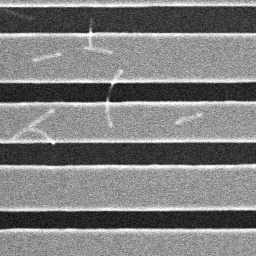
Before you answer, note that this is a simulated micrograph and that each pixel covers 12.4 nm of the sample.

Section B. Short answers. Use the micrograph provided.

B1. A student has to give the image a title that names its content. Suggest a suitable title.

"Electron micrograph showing lines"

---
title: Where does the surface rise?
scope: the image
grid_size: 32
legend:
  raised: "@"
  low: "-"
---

@@@@@@@@@@@@@@@@@@@@@@@@@@@@@@@@
--------------------------------
--------------------------------
--------------------------------
@@@@@@@@@@@@@@@@@@@@@@@@@@@@@@@@
@@@@@@@@@@@@@@@@@@@@@@@@@@@@@@@@
@@@@@@@@@@@@@@@@@@@@@@@@@@@@@@@@
@@@@@@@@@@@@@@@@@@@@@@@@@@@@@@@@
@@@@@@@@@@@@@@@@@@@@@@@@@@@@@@@@
@@@@@@@@@@@@@@@@@@@@@@@@@@@@@@@@
--------------------------------
--------------------------------
--------------------------------
@@@@@@@@@@@@@@@@@@@@@@@@@@@@@@@@
@@@@@@@@@@@@@@@@@@@@@@@@@@@@@@@@
@@@@@@@@@@@@@@@@@@@@@@@@@@@@@@@@
@@@@@@@@@@@@@@@@@@@@@@@@@@@@@@@@
@@@@@@@@@@@@@@@@@@@@@@@@@@@@@@@@
--------------------------------
--------------------------------
--------------------------------
@@@@@@@@@@@@@@@@@@@@@@@@@@@@@@@@
@@@@@@@@@@@@@@@@@@@@@@@@@@@@@@@@
@@@@@@@@@@@@@@@@@@@@@@@@@@@@@@@@
@@@@@@@@@@@@@@@@@@@@@@@@@@@@@@@@
@@@@@@@@@@@@@@@@@@@@@@@@@@@@@@@@
--------------------------------
--------------------------------
--------------------------------
@@@@@@@@@@@@@@@@@@@@@@@@@@@@@@@@
@@@@@@@@@@@@@@@@@@@@@@@@@@@@@@@@
@@@@@@@@@@@@@@@@@@@@@@@@@@@@@@@@